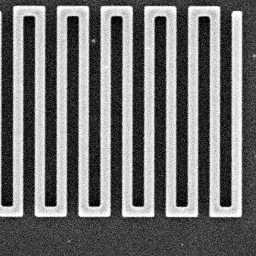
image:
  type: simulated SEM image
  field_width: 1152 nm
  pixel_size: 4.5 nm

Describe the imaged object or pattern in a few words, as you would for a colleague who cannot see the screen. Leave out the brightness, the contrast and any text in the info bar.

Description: groups of lines, slits or small figures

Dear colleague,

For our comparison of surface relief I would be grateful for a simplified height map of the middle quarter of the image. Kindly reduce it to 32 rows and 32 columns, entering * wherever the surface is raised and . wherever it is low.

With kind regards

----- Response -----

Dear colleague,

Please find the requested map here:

*...**...**....**...***...**...*
*...**...**....**...***...**...*
*...**...**....**...***...**...*
*...**...**....**...***...**...*
*...**...**....**...***...**...*
*...**...**....**...***...**...*
*...**...**....**...***...**...*
*...**...**....**...***...**...*
*...**...**....**...**....**...*
*...**...**....**...**....**...*
*...**...**....**...**....**...*
*...**...**....**...**....**...*
*...**...**....**...**....**...*
*...**...**....**...**....**...*
*...**...**....**...**....**...*
*...**...**....**...**....**...*
*...**...**....**...**....**...*
*...**...**....**...**....**...*
*...**...**....**...**....**...*
*...**...**....**...**....**...*
*...**...**....**...**....**...*
*...**...**....**...**....**...*
*...**...**....**...**....**...*
*...**...**....**...**....**...*
*...**...**....**...**....**...*
*...**...**....**...**....**...*
*...**...**....**...**....**...*
*...**...**....**...**....**...*
*...**...**....**...**....**...*
*...**...**....**...**....**...*
*...**...**....**...**....**...*
*...**...**....**...**....**...*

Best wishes